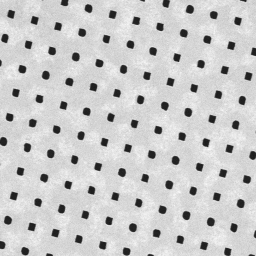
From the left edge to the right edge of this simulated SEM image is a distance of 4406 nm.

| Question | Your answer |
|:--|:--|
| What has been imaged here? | a regular array of holes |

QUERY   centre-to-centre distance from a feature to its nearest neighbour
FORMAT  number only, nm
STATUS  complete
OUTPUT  419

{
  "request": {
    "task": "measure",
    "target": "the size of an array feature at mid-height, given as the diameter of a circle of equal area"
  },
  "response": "0.143 um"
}